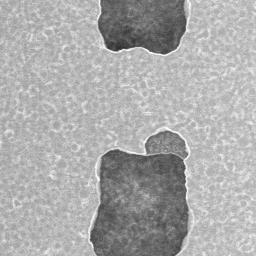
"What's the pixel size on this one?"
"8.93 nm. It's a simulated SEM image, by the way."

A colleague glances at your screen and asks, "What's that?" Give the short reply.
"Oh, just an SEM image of holes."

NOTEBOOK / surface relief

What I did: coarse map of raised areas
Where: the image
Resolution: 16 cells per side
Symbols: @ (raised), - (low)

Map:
@@@@@@------@@@@
@@@@@@------@@@@
@@@@@@-----@@@@@
@@@@@@@@@@@@@@@@
@@@@@@@@@@@@@@@@
@@@@@@@@@@@@@@@@
@@@@@@@@@@@@@@@@
@@@@@@@@@@@@@@@@
@@@@@@@@@@-@@@@@
@@@@@@@-@---@@@@
@@@@@@------@@@@
@@@@@@------@@@@
@@@@@@------@@@@
@@@@@@------@@@@
@@@@@@------@@@@
@@@@@@-----@@@@@